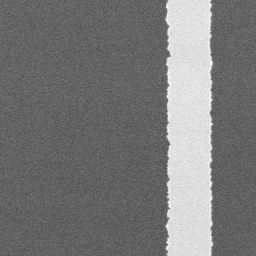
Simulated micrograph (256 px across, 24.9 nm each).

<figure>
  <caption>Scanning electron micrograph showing one or a few lines or trenches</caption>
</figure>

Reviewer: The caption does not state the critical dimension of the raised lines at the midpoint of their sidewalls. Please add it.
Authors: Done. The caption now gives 1.05 µm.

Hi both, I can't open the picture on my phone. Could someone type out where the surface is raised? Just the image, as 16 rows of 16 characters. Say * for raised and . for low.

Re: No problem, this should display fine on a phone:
..........***...
..........***...
...........**...
...........**...
...........**...
...........**...
...........**...
...........**...
...........**...
...........**...
...........**...
...........**...
...........**...
...........**...
..........***...
..........***...